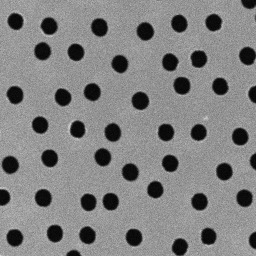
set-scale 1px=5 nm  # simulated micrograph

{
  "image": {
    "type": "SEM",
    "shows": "a regular array of holes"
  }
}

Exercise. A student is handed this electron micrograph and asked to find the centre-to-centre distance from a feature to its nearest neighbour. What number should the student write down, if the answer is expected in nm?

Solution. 169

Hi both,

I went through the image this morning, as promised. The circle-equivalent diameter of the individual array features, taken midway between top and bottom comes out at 86.1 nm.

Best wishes